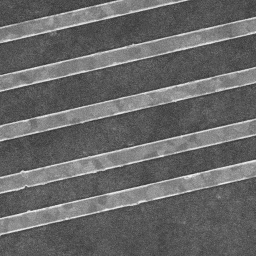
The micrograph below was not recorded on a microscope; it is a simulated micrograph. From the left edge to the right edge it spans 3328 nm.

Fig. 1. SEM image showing parallel lines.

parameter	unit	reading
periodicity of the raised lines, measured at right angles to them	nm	606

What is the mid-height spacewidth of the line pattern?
437 nm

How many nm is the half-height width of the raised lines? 200